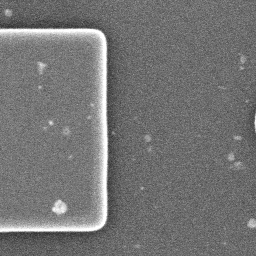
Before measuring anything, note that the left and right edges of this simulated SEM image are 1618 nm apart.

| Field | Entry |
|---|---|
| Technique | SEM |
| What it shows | wiring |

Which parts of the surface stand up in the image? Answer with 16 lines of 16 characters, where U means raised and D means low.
DDDDDDDDDDDDDDDD
DDDDDDDDDDDDDDDD
UUUUUUUDDDDDDDDD
UUUUUUUDDDDDDDDD
UUUUUUUDDDDDDDDD
UUUUUUUDDDDDDDDD
UUUUUUUDDDDDDDDD
UUUUUUUDDDDDDDDD
UUUUUUUDDDDDDDDD
UUUUUUUDDDDDDDDD
UUUUUUUDDDDDDDDD
UUUUUUUDDDDDDDDD
UUUUUUUDDDDDDDDD
UUUUUUUDDDDDDDDD
DDDDDDDDDDDDDDDD
DDDDDDDDDDDDDDDD